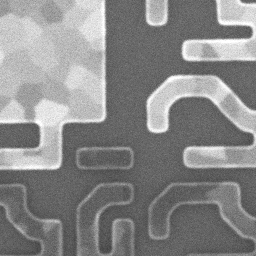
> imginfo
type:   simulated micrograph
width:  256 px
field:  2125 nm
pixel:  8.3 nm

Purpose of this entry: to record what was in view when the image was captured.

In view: wiring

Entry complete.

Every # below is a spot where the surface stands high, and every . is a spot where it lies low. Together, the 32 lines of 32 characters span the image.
#############.....###......####.
#############.....###......#####
#############.....###......#####
#############..................#
#############..................#
#############..........#########
#############..........#########
#############...................
#############...................
#############..........####.....
#############.......########....
#############......##########...
#############......###....####..
#############......##......####.
#############......##.......####
.....###...........##........###
.....###.......................#
.....###........................
.....###................########
########..#######......#########
########..#######......#########
................................
................................
###.........#####....#########..
###........######...##########..
###.......######...####....###..
.###......###......###......###.
.#####....##...#...##.......####
..######..##..###..##........###
...#####..##..###..##.........##
.....###..##..###...............
.....###..###.###...............